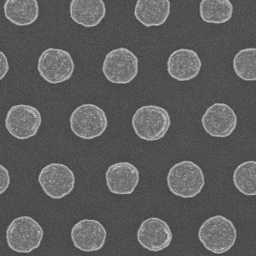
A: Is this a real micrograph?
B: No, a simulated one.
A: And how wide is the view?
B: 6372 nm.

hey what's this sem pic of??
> a regular array of raised bodies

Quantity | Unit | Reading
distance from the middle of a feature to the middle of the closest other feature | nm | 1580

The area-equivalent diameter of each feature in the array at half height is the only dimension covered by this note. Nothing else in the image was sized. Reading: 0.856 microns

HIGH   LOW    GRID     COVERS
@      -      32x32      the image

-@@@@----@@@@----@@@@----@@@@---
-@@@@----@@@@----@@@@----@@@@---
-@@@-----@@@@----@@@@-----@@----
--------------------------------
--------------------------------
--------------------------------
------@@------@@------@@------@@
@----@@@@----@@@@----@@@@----@@@
@----@@@@----@@@@----@@@@----@@@
-----@@@@----@@@@-----@@------@@
--------------------------------
--------------------------------
--------------------------------
--@@------@@------@@------@@@---
-@@@@----@@@@----@@@@-----@@@---
-@@@@----@@@@----@@@@----@@@@---
-@@@-----@@@@----@@@@-----@@@---
--------------------------------
--------------------------------
--------------------------------
---------------@------@@------@@
@----@@@@----@@@@----@@@@----@@@
@----@@@@----@@@@----@@@@----@@@
@----@@@@-----@@@----@@@@-----@@
------@@---------------@--------
--------------------------------
--------------------------------
--@@------@-------@@------@@----
-@@@@----@@@@-----@@@----@@@@---
-@@@@----@@@@----@@@@----@@@@---
-@@@@----@@@@-----@@@----@@@@---
---------------------------@----